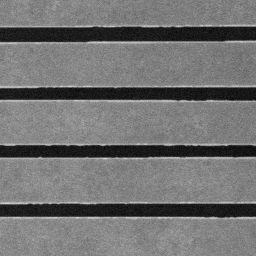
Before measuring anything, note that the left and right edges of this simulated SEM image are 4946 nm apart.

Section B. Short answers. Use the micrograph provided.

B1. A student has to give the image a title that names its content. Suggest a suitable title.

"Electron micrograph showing lines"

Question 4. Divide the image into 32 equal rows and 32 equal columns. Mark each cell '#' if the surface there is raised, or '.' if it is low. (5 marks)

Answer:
################################
################################
################################
................................
................................
################################
################################
################################
################################
################################
################################
................................
................................
################################
################################
################################
################################
################################
................................
................................
################################
################################
################################
################################
################################
................................
................................
################################
################################
################################
################################
################################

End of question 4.